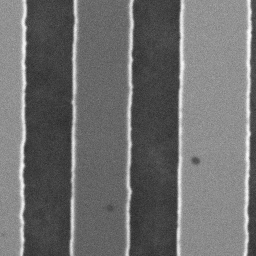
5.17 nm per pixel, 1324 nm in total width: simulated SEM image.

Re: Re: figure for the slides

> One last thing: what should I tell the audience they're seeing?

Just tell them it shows lines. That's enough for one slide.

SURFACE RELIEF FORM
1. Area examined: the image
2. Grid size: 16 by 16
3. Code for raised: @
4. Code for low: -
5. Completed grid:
@@---@@@---@@@@@
@@---@@@---@@@@@
@@---@@@---@@@@@
@@---@@@---@@@@@
@@---@@@---@@@@@
@@---@@@---@@@@@
@@---@@@---@@@@@
@@---@@@---@@@@@
@@---@@@---@@@@@
@----@@@---@@@@@
@----@@@---@@@@@
@---@@@@---@@@@@
@---@@@@---@@@@-
@---@@@@---@@@@-
@---@@@@---@@@@-
@---@@@@---@@@@-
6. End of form